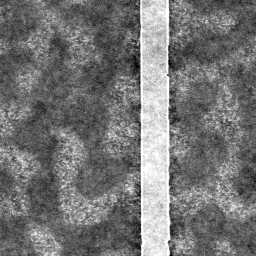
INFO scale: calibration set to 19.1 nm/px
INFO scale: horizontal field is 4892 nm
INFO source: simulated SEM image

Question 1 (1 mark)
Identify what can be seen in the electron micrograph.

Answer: one or a few lines or trenches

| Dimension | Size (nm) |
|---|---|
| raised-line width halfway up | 509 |